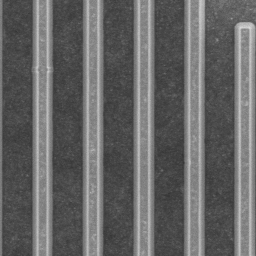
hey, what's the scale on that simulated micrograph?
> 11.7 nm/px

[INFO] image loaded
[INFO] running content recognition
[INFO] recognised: parallel lines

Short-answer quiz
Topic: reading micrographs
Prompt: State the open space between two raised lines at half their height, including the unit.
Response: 425 nm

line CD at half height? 167 nm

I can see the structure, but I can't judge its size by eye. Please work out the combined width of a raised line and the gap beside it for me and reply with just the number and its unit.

0.592 um